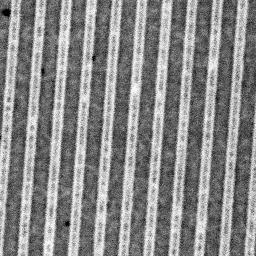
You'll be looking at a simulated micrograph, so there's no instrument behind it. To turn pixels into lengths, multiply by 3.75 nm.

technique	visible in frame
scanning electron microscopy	parallel lines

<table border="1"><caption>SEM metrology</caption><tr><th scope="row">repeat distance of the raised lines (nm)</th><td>94.1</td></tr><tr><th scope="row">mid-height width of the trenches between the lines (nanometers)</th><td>65.4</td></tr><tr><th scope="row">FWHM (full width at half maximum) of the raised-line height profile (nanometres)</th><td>31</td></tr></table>